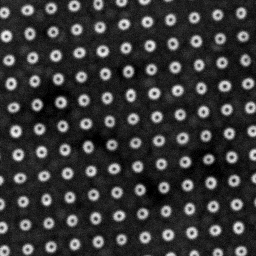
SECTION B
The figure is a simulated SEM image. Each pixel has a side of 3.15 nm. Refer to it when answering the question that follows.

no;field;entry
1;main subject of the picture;a regular array of ring-shaped raised bodies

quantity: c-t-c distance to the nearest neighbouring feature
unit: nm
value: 73.4